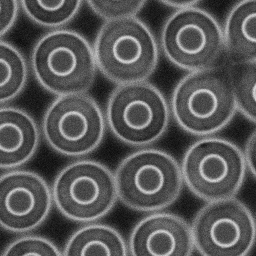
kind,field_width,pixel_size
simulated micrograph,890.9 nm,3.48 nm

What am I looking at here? an array of small figures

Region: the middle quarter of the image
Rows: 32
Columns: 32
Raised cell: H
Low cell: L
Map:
HHHLLLLHHLLLLLLLLLLLLLHHHHHHHHLL
HHLLLLLHHHLLLLLLLLLLLLHHHHHHHHHH
LLLLLLLHHHHLLLLLLLLLLHHHHHHHHHHH
LLLLLLLHHHHHLLLLLLLLHHHHHHHHHHHL
LLLLLLHHHHHHHHHLLLHHHHHHHHHHHHLL
LLLLLHHHHHHHHHHLLLLLLHHHHHHHHLLL
LLLLHHHHHHHHHHLLLLLLLLLHHHHHLLLL
LLLLHHHHHHHHHLLLLLLLLLLLHHHHLLLL
LLLLLLHHHHHHLLLLLLLLLLLLHHHHLLLL
LLLLLLLHHHHHLLLLLLLLLLLLLHHHLLLH
LLLLLLLLHHHHLLLLHHHHHLLLLHHHLLLH
LLLLLLLLHHHLLLLHHHHHHLLLLHHHLLLL
LHHHLLLLLHHLLLLHHHHHHHLLLHHHLLLL
HHHHHLLLLHHLLLLHHHHHHHLLLHHHLLLL
HHHHHLLLLHHHLLLLHHHHHLLLLHHHHLLL
HHHHHHLLLHHHLLLLLHHHLLLLLHHHHHLL
HHHHHLLLLHHHHLLLLLLLLLLLHHHHHHHL
HHHHHLLLLHHHHHLLLLLLLLLHHHHHHHHH
LHHHLLLLLHHHHHHLLLLLLLHHHHHHHHHH
LLLLLLLLHHHHHHHHHHLLHHHHHHHHHHHH
LLLLLLLLHHHHHHHHHHHHHHHHHHHHHHHH
LLLLLLHHHHHHHHHHHHHHHHHHHHHHHHHH
HHHHHHHHHHHHHHHHHHHLLLLLHHHHHHHL
HHHHHHHHHHHHHHHHHLLLLLLLLLHHHHHL
HHHHHHHHHHHHHHHLLLLLLLLLLLLHHHLL
HHHLLLLLLHHHHHLLLLLLLLLLLLLLHHLL
HLLLLLLLLLHHHHLLLLLHHHHHLLLLHHLL
LLLLLLLLLLLHHHLLLLHHHHHHLLLLLHLL
LLLLLHLLLLLLHLLLLLHHHHHHLLLLLHHL
LLLHHHHHLLLLHLLLLLHHHHHHLLLLLHHL
LLHHHHHHLLLLLLLLLLHHHHHHLLLLLHHH
LLHHHHHHLLLLLHLLLLLHHHHLLLLLHHHH